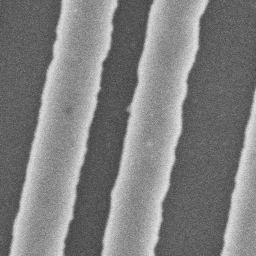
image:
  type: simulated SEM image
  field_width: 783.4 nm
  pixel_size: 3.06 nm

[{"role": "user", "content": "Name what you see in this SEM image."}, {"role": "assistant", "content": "lines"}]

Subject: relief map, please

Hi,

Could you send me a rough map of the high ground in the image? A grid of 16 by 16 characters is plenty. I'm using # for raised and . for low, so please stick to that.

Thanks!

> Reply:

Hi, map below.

....###..####...
....###..###....
...####..###....
...####..###....
...###...###....
...###...###....
...###..###.....
..####..###.....
..###...###....#
..###...###....#
..###..####....#
.####..####....#
.####..###....##
.####..###....##
.###...###....##
.###..####....##